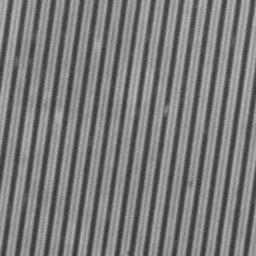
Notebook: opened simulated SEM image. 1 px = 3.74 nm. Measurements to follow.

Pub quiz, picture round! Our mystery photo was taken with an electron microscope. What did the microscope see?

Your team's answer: parallel lines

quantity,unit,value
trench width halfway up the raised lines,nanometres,28.6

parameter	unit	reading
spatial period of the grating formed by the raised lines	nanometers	52.7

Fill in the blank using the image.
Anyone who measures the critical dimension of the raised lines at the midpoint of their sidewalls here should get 25.4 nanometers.